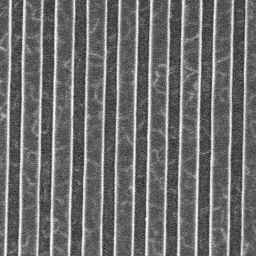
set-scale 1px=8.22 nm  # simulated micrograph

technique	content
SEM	parallel lines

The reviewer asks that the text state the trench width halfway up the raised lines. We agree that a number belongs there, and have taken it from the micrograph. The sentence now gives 107 nm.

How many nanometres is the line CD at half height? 153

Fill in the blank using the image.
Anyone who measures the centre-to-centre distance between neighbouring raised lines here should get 261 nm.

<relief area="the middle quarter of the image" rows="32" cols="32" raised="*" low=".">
**....****....****...*****...***
**....****....****...*****...***
**....****....****...*****...***
**....****....****...*****....**
**....****...*****...*****...***
**....****...*****...*****...***
**....****...*****...*****...***
**....****...*****...*****...***
**....****...*****...*****...***
**...*****...*****...*****...***
**...*****...*****...*****...***
**...*****...*****...*****...***
**...*****...*****...*****...***
**...*****...*****...*****...***
**...*****...*****...*****...***
**...*****...*****...*****...***
**...*****...*****...*****...***
**...*****...*****...*****...***
**...*****...*****...****....***
**...*****...*****...*****...***
**...*****...*****...*****...***
**...*****...*****...*****...***
**...*****...*****...*****...***
**...*****...*****...*****...***
**...*****...****....*****...***
**...*****...****....*****...***
**...*****...****....*****...***
**...*****...****....*****...***
**...*****...****....*****...***
**...*****...****....*****...***
**...****....****....****....***
**...****....****....****....***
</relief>